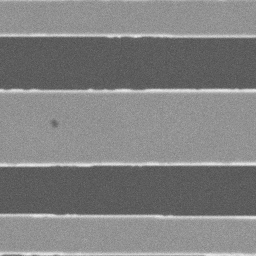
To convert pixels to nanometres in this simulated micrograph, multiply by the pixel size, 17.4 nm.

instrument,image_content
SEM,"lines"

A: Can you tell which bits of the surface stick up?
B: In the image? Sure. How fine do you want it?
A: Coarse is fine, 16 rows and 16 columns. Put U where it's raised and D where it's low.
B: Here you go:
UUUUUUUUUUUUUUUU
UUUUUUUUUUUUUUUU
DDDDDDDDDDDDDDDD
DDDDDDDDDDDDDDDD
DDDDDDDDDDDDDDDD
DDDDDDDDDDDDDDDD
UUUUUUUUUUUUUUUU
UUUUUUUUUUUUUUUU
UUUUUUUUUUUUUUUU
UUUUUUUUUUUUUUUU
DDDDDDDDDDDDDDDD
DDDDDDDDDDDDDDDD
DDDDDDDDDDDDDDDD
UUUUUUUUUUUDDDDD
UUUUUUUUUUUUUUUU
UUUUUUUUUUUUUUUU